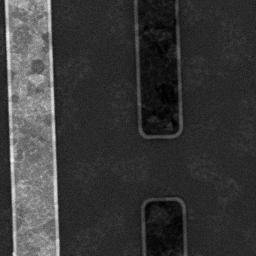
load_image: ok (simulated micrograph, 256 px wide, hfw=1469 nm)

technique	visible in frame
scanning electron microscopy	one or a few lines or trenches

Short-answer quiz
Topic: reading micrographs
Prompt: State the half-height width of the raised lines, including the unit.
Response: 0.245 micrometres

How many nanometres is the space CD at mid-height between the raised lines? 496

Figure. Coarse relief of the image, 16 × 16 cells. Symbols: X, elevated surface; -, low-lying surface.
XXX------XX-----
XXX------XX-----
XXX------XX-----
-XX------XX-----
-XX------XX-----
-XX------XX-----
-XX------XX-----
-XX------XX-----
-XX------XX-----
-XX-------------
-XX-------------
-XX-------------
-XX-------X-----
-XXX-----XXX----
-XXX-----XXX----
-XXX-----XXX----